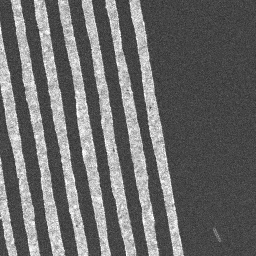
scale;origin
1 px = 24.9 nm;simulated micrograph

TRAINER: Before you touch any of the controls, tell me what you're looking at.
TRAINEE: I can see parallel lines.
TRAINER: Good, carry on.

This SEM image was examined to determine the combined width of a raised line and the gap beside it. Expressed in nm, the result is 582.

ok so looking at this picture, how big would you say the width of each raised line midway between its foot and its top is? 245 nm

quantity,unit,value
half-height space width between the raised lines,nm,340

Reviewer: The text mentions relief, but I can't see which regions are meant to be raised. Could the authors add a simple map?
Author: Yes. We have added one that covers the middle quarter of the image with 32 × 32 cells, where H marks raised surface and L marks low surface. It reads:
LLHHLLLHHHLLLHHHLLLHHHLLLLLLLLLL
LLHHLLLLHHLLLLHHLLLHHHLLLLLLLLLL
LLHHLLLLHHLLLLHHLLLLHHLLLLLLLLLL
LLHHHLLLHHLLLLHHLLLLHHLLLLLLLLLL
LLHHHLLLHHLLLLHHLLLLHHLLLLLLLLLL
LLLHHLLLHHHLLLHHHLLLHHLLLLLLLLLL
LLLHHLLLHHHLLLHLHLLLHHHLLLLLLLLL
LLLHHLLLLHHLLLHHLLLLHHHLLLLLLLLL
LLLHHLLLLHHLLLLHHLLLHHHLLLLLLLLL
LLLHHLLLLHHLLLLHHLLLHHHLLLLLLLLL
LLLHHHLLLHHHLLLHHHLLLHHLLLLLLLLL
LLLHHHLLLHHHLLLHHHLLLLHLLLLLLLLL
LLLHHHLLLHHHLLLHHHLLLHHHLLLLLLLL
LLLHHHLLLLHHLLLLHHLLLHHHLLLLLLLL
LLLHHHLLLHHHLLLLHHLLLHHHLLLLLLLL
LLLLHHLLLLHHLLLLHHHLLHHLLLLLLLLL
LLLLHHHLLLHHLLLLHHHLLHHLLLLLLLLL
HLLLHHHLLLHHLLLLHHHLLLHHHLLLLLLL
HLLLHHHLLLHHHLLLHHHLLLHHHLLLLLLL
HLLLHHHLLLHHHLLLHHHLLLHHHLLLLLLL
HLLLHHHHLLHLLLLLLHHHLLHHHLLLLLLL
HLLLLHHHLLLLLLLLLHHHLLLHHLLLLLLL
HLLLLHHHLLLHHLLLLHHHLLLHHLLLLLLL
HLLLLHHHLLLHHHLLLHHHLLLHHHLLLLLL
HHLLLHHHLLLHHHLLLHHHLLLHHHLLLLLL
HHLLLHHHLLLHHHLLLLHHLLLHHHLLLLLL
HHLLLLHHLLLLHHLLLLHHHLLLHHLLLLLL
HHLLLLHHHLLLHHLLLLHHHLLLHHLLLLLL
HHHLLLHHHLLLHHHLLLHHHLLLHHLLLLLL
HHHLLLHHHLLLHHHLLLHHHLLLHHHLLLLL
LHHLLLHHHLLLHHHLLLHHHLLLHHHLLLLL
LHHLLLLHHLLLHHHLLLLHHLLLLHHLLLLL